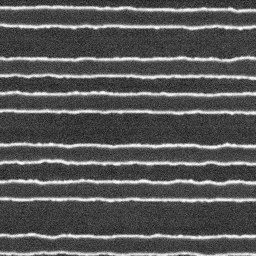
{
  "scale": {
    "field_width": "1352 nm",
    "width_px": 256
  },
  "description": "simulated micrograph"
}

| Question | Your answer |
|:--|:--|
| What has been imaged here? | lines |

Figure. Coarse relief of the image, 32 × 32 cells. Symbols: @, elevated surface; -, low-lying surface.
--------------------------------
@@@@@@@@@@@@@@@@@@@@@@@@@@@@@@@@
@@@@@@@@@@@@@@@@@@@@@@@@@@@@@@@@
-----------------------@@-----@-
--------------------------------
--------------------------------
--------------------------------
@@@@@@@@@@@@@@@@@@@@@@@@@@@@@@@@
@@@@@@@@@@@@@@@@@@@@@@@@@@@@@@@@
@@@@@@@@@@@@@@@@@@@@@@@@@@@@@@@@
--------------------------------
--------------------------------
@@@@@@@@@@@@@@@@@@@@@@@@@@@@@@@@
@@@@@@@@@@@@@@@@@@@@@@@@@@@@@@@@
--------------------------------
--------------------------------
--------------------------------
--------------------------------
@@@@@@@@@@@@@@@@@@@@@@@@@@@@@@@@
@@@@@@@@@@@@@@@@@@@@@@@@@@@@@@@@
------------@@@---@--@-@@@-@@-@@
--------------------------------
--------------------------------
@@@@@@@@@@@@@@@@@@@@@@@@@@@@@@@@
@@@@@@@@@@@@@@@@@@@@@@@@@@@@@@@@
--------------------------------
--------------------------------
--------------------------------
--------------------------------
@@@@@@-@@@@@--@@@@@@@@@----@@@@@
@@@@@@@@@@@@@@@@@@@@@@@@@@@@@@@@
@@@@@@@@@@@@@@@@@@@@@@@@@@@@@@@@